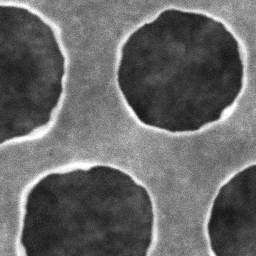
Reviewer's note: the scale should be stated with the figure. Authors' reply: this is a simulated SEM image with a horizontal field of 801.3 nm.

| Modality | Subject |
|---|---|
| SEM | holes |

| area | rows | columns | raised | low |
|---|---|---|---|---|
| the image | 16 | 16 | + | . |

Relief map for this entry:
..++++++++++++++
...++++++.....++
....++++.......+
....+++........+
....+++........+
....+++........+
....++++.......+
...++++++.....++
..++++++++++++++
++++++++++++++++
+++++..++++++++.
++.......+++++..
+........++++...
+.........+++...
+.........+++...
+.........+++...